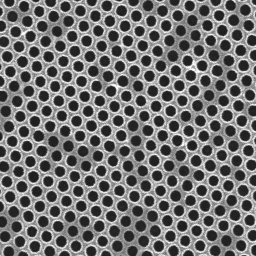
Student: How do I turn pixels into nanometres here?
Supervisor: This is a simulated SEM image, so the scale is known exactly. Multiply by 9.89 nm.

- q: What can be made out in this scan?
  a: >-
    a regular array of holes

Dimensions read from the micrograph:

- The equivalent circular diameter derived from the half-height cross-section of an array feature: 11.2 pixels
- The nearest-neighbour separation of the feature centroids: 15.1 pixels